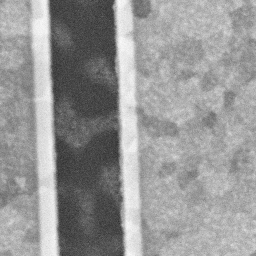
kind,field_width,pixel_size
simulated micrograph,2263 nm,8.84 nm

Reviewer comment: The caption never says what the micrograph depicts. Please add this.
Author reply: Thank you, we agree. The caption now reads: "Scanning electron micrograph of one or a few lines or trenches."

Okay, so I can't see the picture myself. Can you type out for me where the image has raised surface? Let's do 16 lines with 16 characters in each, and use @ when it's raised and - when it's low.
@@@-----@@@@@@@@
@@@-----@@@@@@@@
@@@-----@@@@@@@@
@@@-----@@@@@@@@
@@@-----@@@@@@@@
@@@-----@@@@@@@@
@@@-----@@@@@@@@
@@@-----@@@@@@@@
@@@-----@@@@@@@@
@@@-----@@@@@@@@
@@@-----@@@@@@@@
@@@-----@@@@@@@@
@@@-----@@@@@@@@
@@@-----@@@@@@@@
@@@-----@@@@@@@@
@@@-----@@@@@@@@